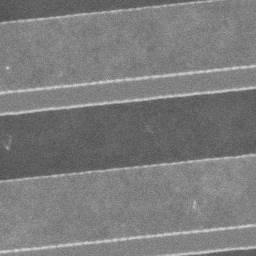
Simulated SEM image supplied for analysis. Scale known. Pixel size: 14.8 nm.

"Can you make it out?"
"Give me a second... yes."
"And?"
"lines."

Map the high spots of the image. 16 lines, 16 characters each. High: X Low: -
---------XXXXXXX
XXXXXXXXXXXXXXXX
XXXXXXXXXXXXXXXX
XXXXXXXXXXXXXXXX
XXXXXXXXXXXXXXXX
XXXXXXXXXXXXXXXX
XXXXXXX---------
----------------
----------------
----------------
--------XXXXXXXX
XXXXXXXXXXXXXXXX
XXXXXXXXXXXXXXXX
XXXXXXXXXXXXXXXX
XXXXXXXXXXXXXXXX
XXXXXXXXXXXXXXXX